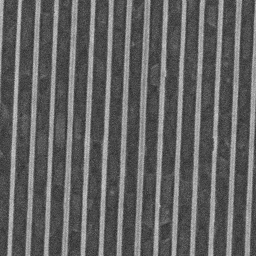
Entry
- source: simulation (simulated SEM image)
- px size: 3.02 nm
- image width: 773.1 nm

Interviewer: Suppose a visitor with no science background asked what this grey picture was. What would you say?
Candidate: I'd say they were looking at parallel lines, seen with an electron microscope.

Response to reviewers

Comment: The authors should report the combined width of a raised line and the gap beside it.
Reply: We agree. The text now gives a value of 55.1 nanometers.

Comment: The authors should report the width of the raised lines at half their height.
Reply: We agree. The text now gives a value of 11.7 nanometres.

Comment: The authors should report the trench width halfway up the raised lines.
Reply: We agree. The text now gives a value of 42.9 nm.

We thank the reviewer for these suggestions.